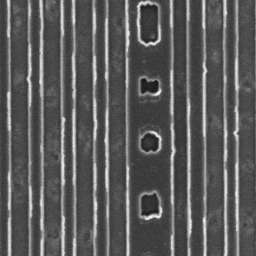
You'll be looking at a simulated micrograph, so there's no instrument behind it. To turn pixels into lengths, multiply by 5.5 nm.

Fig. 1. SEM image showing parallel lines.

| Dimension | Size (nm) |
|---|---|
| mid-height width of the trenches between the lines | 99.1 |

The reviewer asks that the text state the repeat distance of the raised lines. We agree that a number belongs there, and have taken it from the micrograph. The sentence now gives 32.6 px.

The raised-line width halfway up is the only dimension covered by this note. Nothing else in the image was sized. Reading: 0.0798 microns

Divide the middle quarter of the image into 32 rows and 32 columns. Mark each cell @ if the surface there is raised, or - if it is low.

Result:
@@@----@@@@-----@@@@@@@@@@@----@
@@@----@@@@-----@@@@@@@@@@@----@
@@@----@@@@-----@@@@@@@@@@@----@
@@@----@@@@-----@@@@@@@@@@@----@
@@@-----@@@----@@@@-----@@@----@
@@@----@@@@-----@@@-----@@@----@
@@@----@@@@-----@@@-----@@@----@
@@@----@@@@-----@@@@@@@@@@@----@
@@@----@@@@-----@@@@@@@@@@@----@
@@@----@@@@-----@@@@@@@@@@@----@
@@@----@@@@-----@@@@@@@@@@@----@
@@@----@@@@-----@@@@@@@@@@@----@
@@@----@@@@-----@@@@@@@@@@@----@
@@@----@@@@-----@@@@@@@@@@@----@
@@@-----@@@-----@@@@@@@@@@@----@
@@@-----@@@-----@@@@@@@@@@@----@
@@@-----@@@-----@@@@@@@@@@@----@
@@@----@@@@-----@@@@--@@@@@----@
@@@----@@@@-----@@@-----@@@----@
@@@----@@@@-----@@@-----@@@----@
@@@----@@@@-----@@@-----@@@----@
@@@----@@@@-----@@@@---@@@@@---@
@@@-----@@@-----@@@@@@@@@@@----@
@@@-----@@@-----@@@@@@@@@@@----@
@@@----@@@@-----@@@@@@@@@@@----@
@@@----@@@@-----@@@@@@@@@@@----@
@@@----@@@@-----@@@@@@@@@@@----@
@@@----@@@@-----@@@@@@@@@@@----@
@@@----@@@@-----@@@@@@@@@@@----@
@@@----@@@@-----@@@@@@@@@@@----@
@@@-----@@@-----@@@@@@@@@@@----@
@@@-----@@@-----@@@@@@@@@@@----@